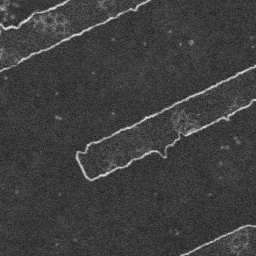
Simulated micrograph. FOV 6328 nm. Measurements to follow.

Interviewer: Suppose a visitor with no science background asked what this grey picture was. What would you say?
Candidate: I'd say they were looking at one or a few lines or trenches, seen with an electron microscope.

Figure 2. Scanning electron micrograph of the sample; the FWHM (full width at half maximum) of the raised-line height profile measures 0.812 microns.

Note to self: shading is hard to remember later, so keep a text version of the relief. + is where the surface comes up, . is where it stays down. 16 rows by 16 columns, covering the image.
...+++++........
.+++++..........
++++............
++..............
...............+
.............+++
...........+++++
.........+++++..
.......++++.....
.....+++++......
.....++.........
................
................
................
...............+
............++++